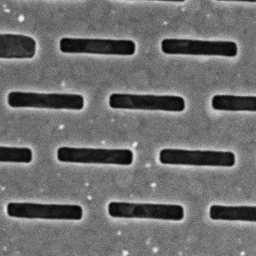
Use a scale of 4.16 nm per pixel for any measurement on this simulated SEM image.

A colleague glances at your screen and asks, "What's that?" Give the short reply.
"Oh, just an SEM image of a regular array of holes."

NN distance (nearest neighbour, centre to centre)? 309 nm